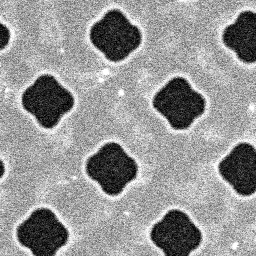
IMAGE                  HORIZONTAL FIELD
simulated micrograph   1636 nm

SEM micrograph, holes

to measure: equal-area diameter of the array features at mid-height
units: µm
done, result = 0.309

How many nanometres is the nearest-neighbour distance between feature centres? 594